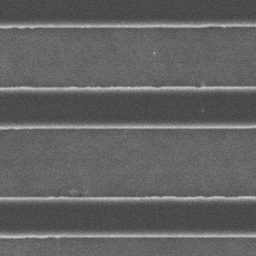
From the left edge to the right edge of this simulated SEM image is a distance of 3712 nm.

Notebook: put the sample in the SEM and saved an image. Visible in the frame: lines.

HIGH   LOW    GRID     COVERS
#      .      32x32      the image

################################
################################
################################
................................
................................
................................
................................
................................
................................
................................
................................
################################
################################
################################
################################
################################
................................
................................
................................
................................
................................
................................
................................
................................
................................
################################
################################
################################
################################
################################
................................
................................